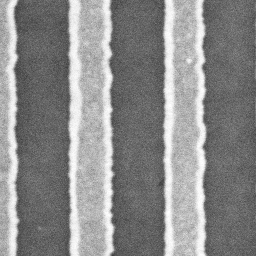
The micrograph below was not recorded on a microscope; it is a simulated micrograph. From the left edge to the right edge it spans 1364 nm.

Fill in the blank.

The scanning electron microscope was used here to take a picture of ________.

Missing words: lines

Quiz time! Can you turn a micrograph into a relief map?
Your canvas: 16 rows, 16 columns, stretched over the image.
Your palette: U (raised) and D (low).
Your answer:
UDDDDUUDDDDUUDDD
UDDDDUUDDDUUUDDD
UDDDDUUDDDUUUDDD
UDDDDUUDDDUUUDDD
UDDDDUUDDDUUUDDD
UDDDDUUDDDUUUDDD
UDDDDUUDDDDUUDDD
UDDDDUUDDDUUUDDD
UDDDDUUDDDUUUDDD
UDDDDUUDDDUUUDDD
UDDDUUUDDDUUUDDD
UDDDUUUDDDUUUDDD
UDDDUUUDDDUUUDDD
UDDDDUUDDDUUUDDD
UDDDDUUDDDUUUDDD
UDDDDUUDDDDUUDDD